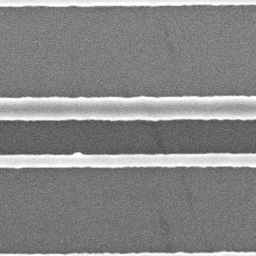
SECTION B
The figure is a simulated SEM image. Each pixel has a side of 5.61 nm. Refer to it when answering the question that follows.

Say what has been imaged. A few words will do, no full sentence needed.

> lines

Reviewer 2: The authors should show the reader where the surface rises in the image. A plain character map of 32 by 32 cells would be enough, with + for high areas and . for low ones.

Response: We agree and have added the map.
++++++++++++++++++++.++.........
................................
................................
................................
................................
................................
................................
................................
................................
................................
................................
................................
++++++++++++++++++++++++++++++++
++++++++++++++++++++++++++++++++
++++++++++++++++++++++++++++++++
................................
................................
................................
................................
..++++++++++++++++++++++++++++++
++++++++++++++++++++++++++++++++
................................
................................
................................
................................
................................
................................
................................
................................
................................
................................
................................